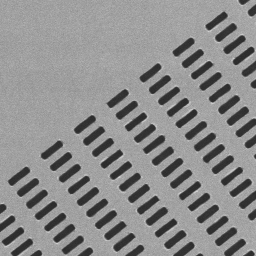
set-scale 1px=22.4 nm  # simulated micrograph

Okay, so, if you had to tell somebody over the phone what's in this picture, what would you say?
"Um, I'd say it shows a regular array of holes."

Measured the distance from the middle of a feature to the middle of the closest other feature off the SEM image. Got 324 nanometers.